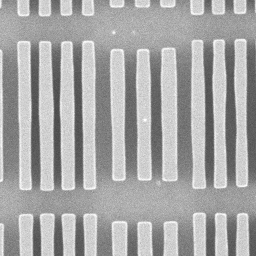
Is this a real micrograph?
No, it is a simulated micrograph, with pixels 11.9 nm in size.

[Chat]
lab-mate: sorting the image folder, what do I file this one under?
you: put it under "groups of lines, slits or small figures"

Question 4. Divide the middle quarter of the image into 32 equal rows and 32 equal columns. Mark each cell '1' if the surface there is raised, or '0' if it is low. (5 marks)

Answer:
11000111000011100011100001110000
11000111000011100011100011110000
11000111000011100011100011110000
11000111000011100011100011110000
11000111000011100011100011110000
11000111000011100011100011110000
11000111000011100011100011110000
11000111000011100011100011110000
11000111000011100011100001110000
11000111000011100011100001110000
11000111000011100011100001110000
11000111000011100011100001110000
11000111000011100011100001110000
11000111000011100011100001110000
11000111000011100011100001110000
11000111000011100011100001110000
11000111000011100011100001110000
11000110000011100011100001110000
11000110000011100001100001110000
11000111000011100011100001110000
11000111000011100011100001110000
11000111000011100011100001110000
11000111000011100011110001110000
11000111000011100011110001110000
11000111000011100011110001110000
11000111000011100011110001110000
11000111000011100011110001110000
11000111000011100001110001110000
11000111000011100001110001110000
11000111000000000000000000000000
11000111000000000000000000000000
00000000000000000000000000000000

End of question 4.